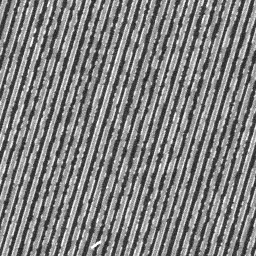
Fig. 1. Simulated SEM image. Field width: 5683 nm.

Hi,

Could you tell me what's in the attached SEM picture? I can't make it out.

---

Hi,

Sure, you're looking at parallel lines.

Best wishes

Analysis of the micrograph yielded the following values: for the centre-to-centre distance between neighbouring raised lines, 8.98 pixels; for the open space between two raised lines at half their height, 109 nm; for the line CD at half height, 85.3 nanometers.